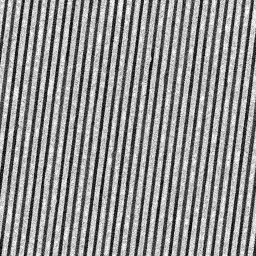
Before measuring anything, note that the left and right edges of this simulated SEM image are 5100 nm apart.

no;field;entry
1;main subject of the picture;parallel lines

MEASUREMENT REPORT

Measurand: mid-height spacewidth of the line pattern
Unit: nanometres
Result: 69.2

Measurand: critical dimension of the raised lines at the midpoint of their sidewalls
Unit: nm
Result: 104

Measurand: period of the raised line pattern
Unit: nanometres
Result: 168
